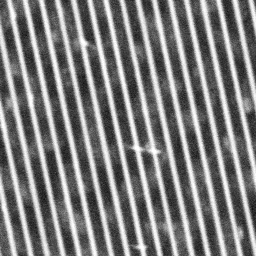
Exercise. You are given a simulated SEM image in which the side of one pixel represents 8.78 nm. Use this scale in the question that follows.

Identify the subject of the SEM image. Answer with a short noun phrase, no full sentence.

parallel lines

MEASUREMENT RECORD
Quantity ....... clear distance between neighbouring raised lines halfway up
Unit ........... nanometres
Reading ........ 111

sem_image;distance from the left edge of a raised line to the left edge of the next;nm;138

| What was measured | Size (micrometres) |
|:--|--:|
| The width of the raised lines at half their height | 0.0225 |